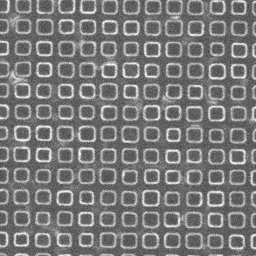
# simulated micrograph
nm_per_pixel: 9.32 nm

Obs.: a regular array of raised bodies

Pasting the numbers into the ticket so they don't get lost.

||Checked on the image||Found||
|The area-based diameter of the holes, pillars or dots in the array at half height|148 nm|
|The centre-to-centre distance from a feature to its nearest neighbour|0.196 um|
